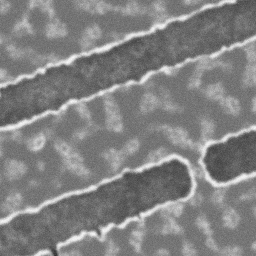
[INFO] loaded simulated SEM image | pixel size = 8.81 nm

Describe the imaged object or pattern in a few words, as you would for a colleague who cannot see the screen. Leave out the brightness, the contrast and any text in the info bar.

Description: one or a few lines or trenches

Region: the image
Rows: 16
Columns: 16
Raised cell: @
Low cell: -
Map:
@@@@@@@@@@@@@---
@@@@@@@@@@------
@@@@@@@@--------
@@@@@--------@@@
@@--------@@@@@@
-------@@@@@@@@@
----@@@@@@@@@@@@
--@@@@@@@@@@@@@@
@@@@@@@@@@@@@@--
@@@@@@@@@@@@@---
@@@@@@@@@---@---
@@@@@@------@@@@
@@@@-------@@@@@
@--------@@@@@@@
------@@@@@@@@@@
----@@@@@@@@@@@@